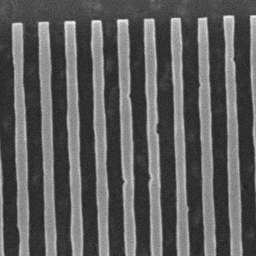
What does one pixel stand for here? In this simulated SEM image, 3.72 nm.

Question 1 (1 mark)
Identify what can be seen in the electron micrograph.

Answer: parallel lines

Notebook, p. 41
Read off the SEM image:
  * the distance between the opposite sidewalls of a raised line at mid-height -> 37.6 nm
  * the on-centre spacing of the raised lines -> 98.4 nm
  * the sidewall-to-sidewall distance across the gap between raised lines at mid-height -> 59.9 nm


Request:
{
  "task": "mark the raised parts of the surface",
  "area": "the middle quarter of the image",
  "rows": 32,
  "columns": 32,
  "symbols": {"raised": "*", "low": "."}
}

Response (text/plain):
.**....***....**.....**....**...
.**....***....**.....**....**...
.**....***....**.....**....**...
.**....***....**.....**....**...
.**.....**....**.....**....***..
.**.....**....**....***.....**..
.**.....**....**.....**....***..
.**.....**....**.....**.....**..
.**.....**....**.....**.....**..
.**.....**....***....**.....*...
.**.....**....***....**.....*...
.***....**....***....**.....**..
.***....**....***....**.....**..
.***....**....***....**.....**..
.***...***....***....**.....**..
.***....**....***....**.....**..
.***....**....***....**.....**..
.***....**....***....**.....**..
.***....**....***....**.....**..
.***....**....***....**.....**..
.***....**....***....**.....**..
.***....**....***....***....**..
.***....**....***....***....**..
.***....**.....**....***....**..
..**....**.....**.....**....**..
..**....**.....**....***....**..
..**....***....**....***....**..
..**....***....**.....**....**..
..**....***....**.....**....**..
..**....***....**....***....**..
..**....***....**.....**....**..
..**....***....**.....**....**..